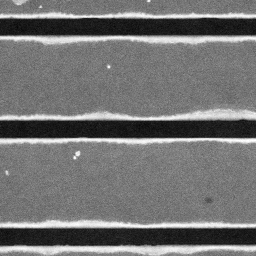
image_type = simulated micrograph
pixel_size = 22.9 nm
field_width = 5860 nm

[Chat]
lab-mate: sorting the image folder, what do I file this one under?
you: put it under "lines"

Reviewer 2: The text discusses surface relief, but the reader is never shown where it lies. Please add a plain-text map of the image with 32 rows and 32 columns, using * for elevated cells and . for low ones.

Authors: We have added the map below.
********************************
********************************
................................
................................
................................
********************************
********************************
********************************
********************************
********************************
********************************
********************************
********************************
********************************
********************************
................................
................................
********************************
********************************
********************************
********************************
********************************
********************************
********************************
********************************
********************************
********************************
********************************
................................
................................
................................
********************************